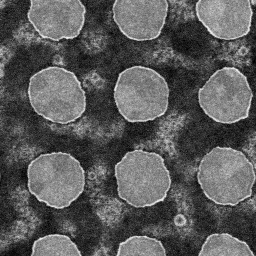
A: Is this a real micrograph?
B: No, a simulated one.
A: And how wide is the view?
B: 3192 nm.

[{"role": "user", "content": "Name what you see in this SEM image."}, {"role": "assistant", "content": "raised bodies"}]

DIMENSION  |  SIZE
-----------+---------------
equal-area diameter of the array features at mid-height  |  690 nanometers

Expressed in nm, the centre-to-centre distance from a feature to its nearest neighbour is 1050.